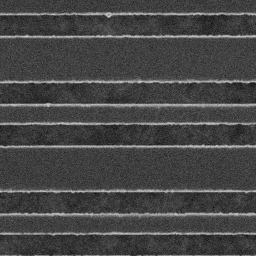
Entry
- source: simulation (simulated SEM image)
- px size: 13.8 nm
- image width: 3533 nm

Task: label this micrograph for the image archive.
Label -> lines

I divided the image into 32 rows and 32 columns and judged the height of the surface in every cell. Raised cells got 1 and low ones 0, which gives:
11111111111111111111111111111111
11111111111111111111111111111111
00000000000000000000000000000000
00000000000000000000000000000000
00000000000000010000000000000000
11111111111111111111111111111111
11111111111111111111111111111111
11111111111111111111111111111111
11111111111111111111111111111111
11111111111111111111111111111111
00000000000000000000000000000000
00000000000000000000000000000000
00000000000000000000000000000000
11111111111111111111111111111111
11111111111111111111111111111111
11111111111111111111111111111111
00000000000000000000000000000000
00000000000000000000000000000000
11111111111111111111111111111111
11111111111111111111111111111111
11111111111111111111111111111111
11111111111111111111111111111111
11111111111111111111111111111111
11111111111111111111111111111111
00000000000000000000000000000000
00000000000000000000000000000000
00000000000000000000000000000000
11111111111111111111111111111111
11111111111111111111111111111111
00000000000000000000000000000000
00000000000000000000000000000000
00000000000000000000000000000000